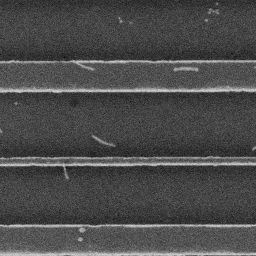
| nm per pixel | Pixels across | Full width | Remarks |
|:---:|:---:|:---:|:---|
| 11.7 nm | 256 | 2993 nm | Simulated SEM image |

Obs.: lines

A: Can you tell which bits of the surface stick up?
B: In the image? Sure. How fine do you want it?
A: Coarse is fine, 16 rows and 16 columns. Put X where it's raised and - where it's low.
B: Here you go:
----------------
----------------
----------------
----------------
XXXXXXXXXXXXXXXX
XXXXXXXXXXXXXXXX
----------------
----------------
----------------
----------------
----------------
----------------
----------------
----------------
XXXXXXXXXXXXXXXX
XXXXXXXXXXXXXXXX